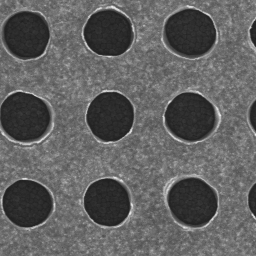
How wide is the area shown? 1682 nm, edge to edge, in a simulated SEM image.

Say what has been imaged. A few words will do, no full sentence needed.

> a regular array of holes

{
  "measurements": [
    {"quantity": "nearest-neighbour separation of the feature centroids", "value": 80.8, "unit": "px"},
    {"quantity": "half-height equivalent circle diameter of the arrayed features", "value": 320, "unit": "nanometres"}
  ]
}